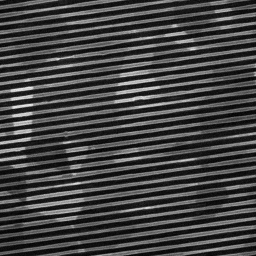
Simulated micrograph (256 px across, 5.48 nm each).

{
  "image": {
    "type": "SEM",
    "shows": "parallel lines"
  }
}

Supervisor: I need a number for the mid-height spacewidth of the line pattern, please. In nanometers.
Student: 34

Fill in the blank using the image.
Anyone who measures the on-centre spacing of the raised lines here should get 46.1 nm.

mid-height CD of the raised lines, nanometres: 14.2